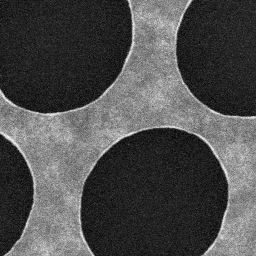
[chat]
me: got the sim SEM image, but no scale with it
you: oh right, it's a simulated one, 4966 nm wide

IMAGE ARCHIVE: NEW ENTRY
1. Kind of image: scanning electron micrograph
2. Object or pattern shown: holes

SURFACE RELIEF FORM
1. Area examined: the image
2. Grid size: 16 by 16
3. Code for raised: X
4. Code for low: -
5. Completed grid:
--------XXXX----
--------XXX-----
--------XXX-----
--------XXX-----
--------XXX-----
-------XXXXX----
X-----XXXXXXX---
XXXXXXXXXXXXXXXX
XXXXXXXX----XXXX
-XXXXXX------XXX
--XXXX--------XX
--XXX---------XX
--XXX---------XX
--XXX---------XX
-XXXX---------XX
-XXXXX-------XXX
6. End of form